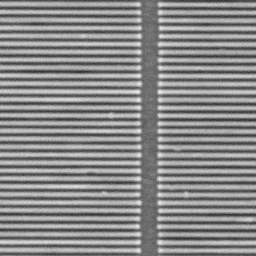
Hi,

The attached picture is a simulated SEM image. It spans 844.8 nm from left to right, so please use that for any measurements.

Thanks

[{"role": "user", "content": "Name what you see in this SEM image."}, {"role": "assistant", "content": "parallel lines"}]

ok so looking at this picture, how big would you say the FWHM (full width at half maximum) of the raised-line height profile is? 12.8 nm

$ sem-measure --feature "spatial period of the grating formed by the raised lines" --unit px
7.94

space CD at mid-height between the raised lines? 12.8 nanometers